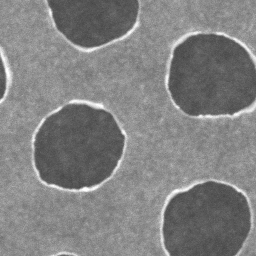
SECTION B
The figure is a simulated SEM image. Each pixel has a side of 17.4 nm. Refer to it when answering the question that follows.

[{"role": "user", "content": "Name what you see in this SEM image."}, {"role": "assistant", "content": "holes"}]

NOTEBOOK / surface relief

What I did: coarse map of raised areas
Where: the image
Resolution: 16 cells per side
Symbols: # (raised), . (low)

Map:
###......#######
###.....########
####...####....#
###########.....
###########.....
###########.....
####.######.....
###....#########
##......########
##......########
##.....#########
###...######..##
###########....#
##########......
##########......
##########.....#